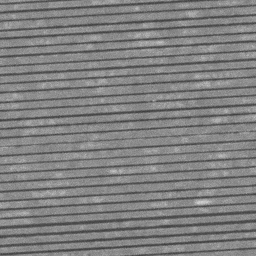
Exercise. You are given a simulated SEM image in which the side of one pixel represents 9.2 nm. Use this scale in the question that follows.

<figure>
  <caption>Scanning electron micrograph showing parallel lines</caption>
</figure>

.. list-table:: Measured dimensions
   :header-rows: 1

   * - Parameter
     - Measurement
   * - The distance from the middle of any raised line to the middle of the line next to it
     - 0.0824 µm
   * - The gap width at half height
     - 24.1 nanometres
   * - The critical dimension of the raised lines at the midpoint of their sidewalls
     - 6.36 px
